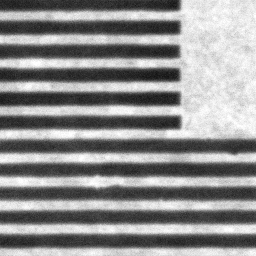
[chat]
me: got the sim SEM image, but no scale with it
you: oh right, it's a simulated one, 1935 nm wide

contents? parallel lines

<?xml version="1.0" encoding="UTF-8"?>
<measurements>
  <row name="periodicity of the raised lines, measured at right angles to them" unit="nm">179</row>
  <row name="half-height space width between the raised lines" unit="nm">106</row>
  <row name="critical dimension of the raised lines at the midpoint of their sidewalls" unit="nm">72.8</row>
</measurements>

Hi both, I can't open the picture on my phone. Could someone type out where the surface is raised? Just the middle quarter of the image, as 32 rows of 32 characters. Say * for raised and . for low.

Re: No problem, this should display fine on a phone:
********************************
.............................***
.............................***
.............................***
.................*****...*...***
********************************
********************************
.............................***
.............................***
.............................***
..*........**................***
********************************
********************************
.............................***
.............................***
.............................***
********************************
********************************
********************************
................................
................................
................................
..**************************.***
********************************
********************************
................................
................................
................................
********************************
********************************
....******.....****.......****.*
................................